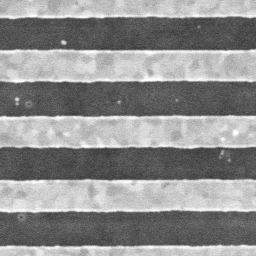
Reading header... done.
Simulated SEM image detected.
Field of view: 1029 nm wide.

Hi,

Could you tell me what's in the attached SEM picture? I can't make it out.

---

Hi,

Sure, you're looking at lines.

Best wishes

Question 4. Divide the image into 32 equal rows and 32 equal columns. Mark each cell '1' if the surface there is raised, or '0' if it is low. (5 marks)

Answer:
11111111111111111111111111111111
11111111111111111111111111111111
00000000000000000000000000000000
00000000000000000000000000000000
00000000000000000000000000000000
00000000000000000000000000000000
11111111111111111111111111111111
11111111111111111111111111111111
11111111111111111111111111111111
11111111111111111111111111111111
00000000000000000000000000000000
00000000000000000000000000000000
00000000000000000000000000000000
00000000000000000000000000000000
00000000000000000000010000001000
11111111111111111111111111111111
11111111111111111111111111111111
11111111111111111111111111111111
00000000000000000000000000000000
00000000000000000000000000000000
00000000000000000000000000000000
00000000000000000000000000000000
00000000001100000000000111110001
11111111111111111111111111111111
11111111111111111111111111111111
11111111111111111111111111111111
00000000000000000000000000000000
00000000000000000000000000000000
00000000000000000000000000000000
00000000000000000000000000000000
00000000000000000000000000000000
11111111111111111111111111111111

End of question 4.